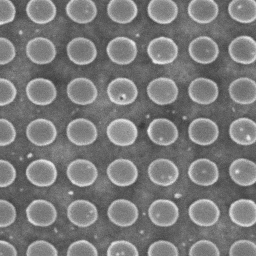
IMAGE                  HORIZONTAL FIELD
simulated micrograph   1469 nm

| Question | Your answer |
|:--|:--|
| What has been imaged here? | a regular array of raised bodies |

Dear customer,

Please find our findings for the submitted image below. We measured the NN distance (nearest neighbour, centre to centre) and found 0.232 microns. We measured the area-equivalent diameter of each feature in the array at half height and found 0.16 microns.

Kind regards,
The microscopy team